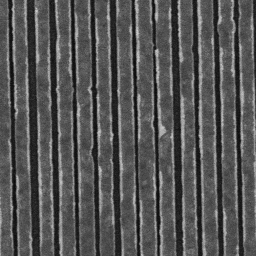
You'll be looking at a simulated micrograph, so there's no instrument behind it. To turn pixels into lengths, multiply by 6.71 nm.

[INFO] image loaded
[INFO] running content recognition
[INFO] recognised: parallel lines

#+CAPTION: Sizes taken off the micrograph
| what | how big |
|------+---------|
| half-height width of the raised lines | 98.1 nm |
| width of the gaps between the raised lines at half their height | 36.9 nm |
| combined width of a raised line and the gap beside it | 138 nm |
